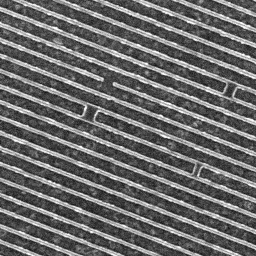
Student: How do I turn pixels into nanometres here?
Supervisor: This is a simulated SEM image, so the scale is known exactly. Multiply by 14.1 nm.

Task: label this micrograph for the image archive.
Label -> parallel lines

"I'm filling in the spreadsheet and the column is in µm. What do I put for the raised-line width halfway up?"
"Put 0.0494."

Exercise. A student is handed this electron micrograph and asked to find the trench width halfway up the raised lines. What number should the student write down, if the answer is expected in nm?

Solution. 155